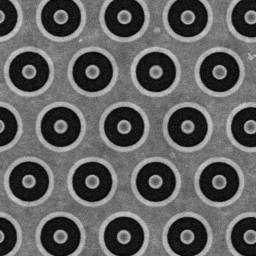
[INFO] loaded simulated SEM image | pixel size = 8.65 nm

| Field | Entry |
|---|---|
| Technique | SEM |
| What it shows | an array of small figures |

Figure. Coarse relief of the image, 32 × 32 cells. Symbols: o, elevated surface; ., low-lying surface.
..ooo.....ooo.....ooo.....ooo...
..ooo.....ooo.....ooo.....ooo...
..ooo.....ooo.....ooo.....ooo...
..ooo.....ooo.....ooo.....ooo...
.ooooo...ooooo...ooooo...ooooo..
oooooooooooooooooooooooooooooooo
oo...ooooo...ooooo...ooooo...ooo
o.....ooo.....ooo.....ooo.....oo
o.....ooo.....ooo.....ooo.....oo
o.....ooo.....ooo.....ooo.....oo
o.....ooo.....ooo.....ooo.....oo
ooo..ooooo...ooooo...ooooo...ooo
oooooooooooooooooooooooooooooooo
.ooooo...ooooo...ooooo...ooooo..
..ooo.....ooo.....ooo.....ooo...
..ooo.....ooo.....ooo.....ooo...
..ooo.....ooo.....ooo.....ooo...
..ooo.....ooo.....ooo.....ooo...
.oooooo..oooooo.ooooooo.oooooo..
oooooooooooooooooooooooooooooooo
oo...ooooo...ooooo...ooooo...ooo
o.....ooo.....ooo.....ooo.....oo
o.....ooo.....ooo.....ooo.....oo
o.....ooo.....ooo.....ooo.....oo
o.....ooo.....ooo.....ooo.....oo
ooo.ooooooo.ooooooo.ooooooo.oooo
oooooooooooooooooooooooooooooooo
.ooooo...ooooo...ooooo...ooooo..
..ooo.....ooo.....ooo.....ooo...
..ooo.....ooo.....ooo.....ooo...
..ooo.....ooo.....ooo.....ooo...
..oooo....ooo.....ooo....oooo...